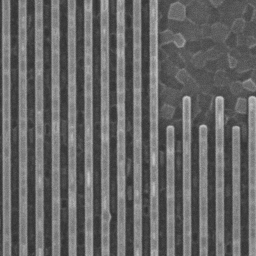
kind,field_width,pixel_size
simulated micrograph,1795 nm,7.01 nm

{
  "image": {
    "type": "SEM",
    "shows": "parallel lines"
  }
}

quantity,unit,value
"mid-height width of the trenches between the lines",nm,67.4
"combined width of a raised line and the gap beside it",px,16.4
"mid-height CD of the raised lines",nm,47.3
